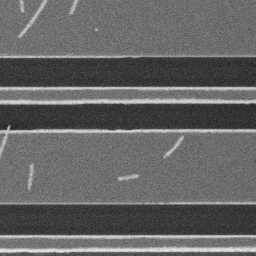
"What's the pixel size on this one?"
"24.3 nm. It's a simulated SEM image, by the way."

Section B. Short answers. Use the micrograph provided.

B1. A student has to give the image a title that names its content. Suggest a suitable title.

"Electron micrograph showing lines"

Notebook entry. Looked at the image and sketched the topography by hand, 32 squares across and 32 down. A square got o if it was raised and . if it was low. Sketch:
oooooooooooooooooooooooooooooooo
oooooooooooooooooooooooooooooooo
oooooooooooooooooooooooooooooooo
oooooooooooooooooooooooooooooooo
oooooooooooooooooooooooooooooooo
oooooooooooooooooooooooooooooooo
oooooooooooooooooooooooooooooooo
................................
................................
................................
................................
oooooooooooooooooooooooooooooooo
oooooooooooooooooooooooooooooooo
................................
................................
................................
oooooooooooooooooooooooooooooooo
oooooooooooooooooooooooooooooooo
oooooooooooooooooooooooooooooooo
oooooooooooooooooooooooooooooooo
oooooooooooooooooooooooooooooooo
oooooooooooooooooooooooooooooooo
oooooooooooooooooooooooooooooooo
oooooooooooooooooooooooooooooooo
oooooooooooooooooooooooooooooooo
................................
................................
................................
................................
oooooooooooooooooooooooooooooooo
oooooooooooooooooooooooooooooooo
................................